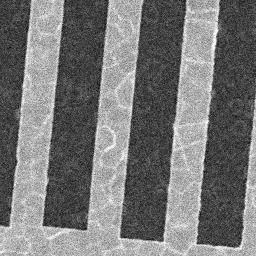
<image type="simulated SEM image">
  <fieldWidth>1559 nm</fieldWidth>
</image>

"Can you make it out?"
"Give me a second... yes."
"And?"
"one or a few lines or trenches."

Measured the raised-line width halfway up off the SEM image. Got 193 nm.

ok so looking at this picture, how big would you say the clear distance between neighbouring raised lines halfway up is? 274 nm